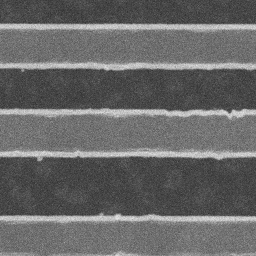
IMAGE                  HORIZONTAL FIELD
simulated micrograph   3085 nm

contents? one or a few lines or trenches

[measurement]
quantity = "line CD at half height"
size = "493 nanometers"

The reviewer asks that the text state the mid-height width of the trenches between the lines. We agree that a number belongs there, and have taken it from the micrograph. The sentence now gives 680 nm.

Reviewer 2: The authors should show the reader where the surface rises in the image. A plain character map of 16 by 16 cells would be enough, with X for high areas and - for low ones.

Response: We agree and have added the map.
----------------
----------------
XXXXXXXXXXXXXXXX
XXXXXXXXXXXXXXXX
----------------
----------------
----------------
XXXXXXXXXXXXXXXX
XXXXXXXXXXXXXXXX
XXXXXXXXXXXXXXXX
----------------
----------------
----------------
----------------
XXXXXXXXXXXXXXXX
XXXXXXXXXXXXXXXX